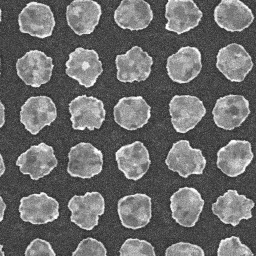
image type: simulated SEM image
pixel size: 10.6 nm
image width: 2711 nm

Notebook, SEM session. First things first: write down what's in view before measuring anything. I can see a regular array of raised bodies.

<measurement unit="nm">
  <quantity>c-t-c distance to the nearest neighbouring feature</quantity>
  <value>497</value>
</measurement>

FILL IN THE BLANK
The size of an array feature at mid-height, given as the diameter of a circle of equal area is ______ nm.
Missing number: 372